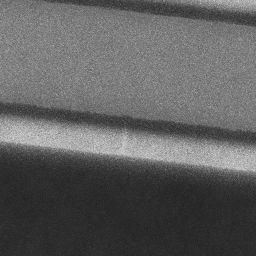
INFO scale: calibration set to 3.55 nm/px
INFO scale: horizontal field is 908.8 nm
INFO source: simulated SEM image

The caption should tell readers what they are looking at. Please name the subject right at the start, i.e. one or a few lines or trenches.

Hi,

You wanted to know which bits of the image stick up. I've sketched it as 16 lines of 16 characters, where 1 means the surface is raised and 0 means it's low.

0000000000000000
0000000000000000
0000000000000000
0000000000000000
0000000000000000
0000000000000000
0000000000000000
0000000000000000
1111000000000000
1111111111111000
1111111111111111
1111111111111111
1111111111111111
1111111111111111
1111111111111111
1111111111111111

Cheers